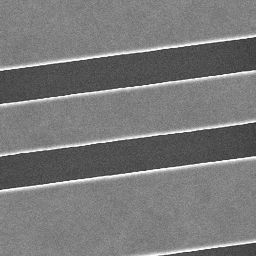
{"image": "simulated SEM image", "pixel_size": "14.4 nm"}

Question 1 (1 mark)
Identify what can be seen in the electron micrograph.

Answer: lines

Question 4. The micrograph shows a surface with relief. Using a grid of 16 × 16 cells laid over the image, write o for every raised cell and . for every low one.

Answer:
oooooooooooooooo
oooooooooooooooo
oooooooooooooo..
ooooooo.........
...............o
........oooooooo
oooooooooooooooo
oooooooooooooooo
ooooooooo.......
oo..............
...........ooooo
...ooooooooooooo
oooooooooooooooo
oooooooooooooooo
oooooooooooooooo
ooooooooooooo...